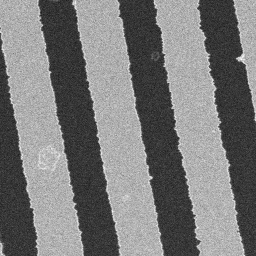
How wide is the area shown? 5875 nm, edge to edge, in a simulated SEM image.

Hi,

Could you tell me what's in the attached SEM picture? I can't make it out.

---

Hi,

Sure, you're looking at one or a few lines or trenches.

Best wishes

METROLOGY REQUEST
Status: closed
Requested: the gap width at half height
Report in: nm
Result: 844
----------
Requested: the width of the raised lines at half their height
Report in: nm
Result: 968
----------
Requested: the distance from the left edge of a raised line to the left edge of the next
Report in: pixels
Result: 78.8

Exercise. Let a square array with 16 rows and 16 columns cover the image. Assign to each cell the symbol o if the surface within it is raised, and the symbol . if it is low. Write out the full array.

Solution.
oo...oo...oo...o
ooo..ooo..oo...o
ooo..ooo..ooo..o
ooo..ooo..ooo..o
ooo..ooo..ooo..o
.oo...oo...oo...
.oo...oo...oo...
.ooo..ooo..ooo..
.ooo..ooo..ooo..
.ooo..ooo..ooo..
.ooo..ooo...oo..
..oo...oo...oo..
..ooo..ooo..ooo.
..ooo..ooo..ooo.
..ooo..ooo..ooo.
..ooo..ooo..ooo.